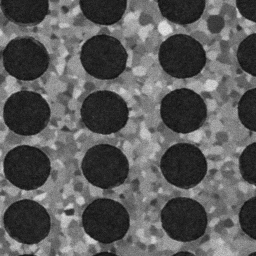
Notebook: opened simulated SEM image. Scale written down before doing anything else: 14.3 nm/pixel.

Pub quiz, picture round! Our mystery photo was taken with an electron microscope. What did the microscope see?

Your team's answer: a regular array of holes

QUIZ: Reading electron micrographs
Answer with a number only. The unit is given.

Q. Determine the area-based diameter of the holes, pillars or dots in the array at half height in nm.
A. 657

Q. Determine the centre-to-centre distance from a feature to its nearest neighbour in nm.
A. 775